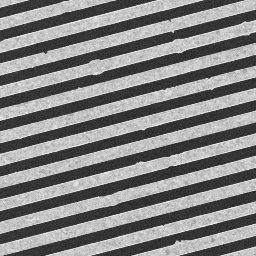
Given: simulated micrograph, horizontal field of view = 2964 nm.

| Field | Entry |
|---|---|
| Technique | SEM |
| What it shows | parallel lines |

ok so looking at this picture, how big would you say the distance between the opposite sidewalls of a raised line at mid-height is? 126 nm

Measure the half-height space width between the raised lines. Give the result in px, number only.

10.9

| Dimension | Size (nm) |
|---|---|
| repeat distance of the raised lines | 254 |